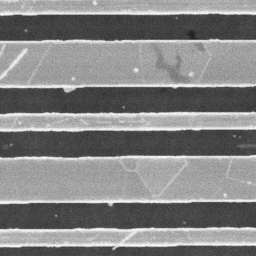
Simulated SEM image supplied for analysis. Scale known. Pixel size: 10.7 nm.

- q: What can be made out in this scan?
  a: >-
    lines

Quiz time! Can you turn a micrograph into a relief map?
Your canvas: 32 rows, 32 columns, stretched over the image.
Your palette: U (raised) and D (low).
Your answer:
UUUUUUUUUUUUUUUUUUUUUUUUUUUUUUUU
UUUUUUUUUUUUUUUUUUUUUUUUUUUUUUUU
DDDDDDDDDDDDDDDDDDDDDDDDDDDDDDDD
DDDDDDDDDDDDDDDDDDDDDDDDDDDDDDDD
DDDDDDDDDDDDDDDDDDDDDDDDDDDDDDDD
UUUUUUUUUUUUUUUUUUUUUUUUUUUUUUUU
UUUUUUUUUUUUUUUUUUUUUUUUUUUUUUUU
UUUUUUUUUUUUUUUUUUUUUUUUUUUUUUUU
UUUUUUUUUUUUUUUUUUUUUUUUUUUUUUUU
UUUUUUUUUUUUUUUUUUUUUUUUUUUUUUUU
UUUUUUUUUUUUUUUUUUUUUUUUUUUUUUUU
DDDDDDDDDDDDDDDDDDDDDDDDDDDDDDDD
DDDDDDDDDDDDDDDDDDDDDDDDDDDDDDDD
DDDDDDDDDDDDDDDDDDDDDDDDDDDDDDDD
UUUUUUUUUUUUUUUUUUUUUUUUUUUUUUUU
UUUUUUUUUUUUUUUUUUUUUUUUUUUUUUUU
DDDDDDDDDDDDDDDDDDDDDDDDDDDDDDDD
DDDDDDDDDDDDDDDDDDDDDDDDDDDDDDDD
DDDDDDDDDDDDDDDDDDDDDDDDDDDDDDDD
DDDDDDDDDDDDDDDDDDDDDDDDDDDDDDDU
UUUUUUUUUUUUUUUUUUUUUUUUUUUUUUUU
UUUUUUUUUUUUUUUUUUUUUUUUUUUUUUUU
UUUUUUUUUUUUUUUUUUUUUUUUUUUUUUUU
UUUUUUUUUUUUUUUUUUUUUUUUUUUUUUUU
UUUUUUUUUUUUUUUUUUUUUUUUUUUUUUUU
DDDDDDDDDDDDDDDDDDDDDDDDDDDDDDDD
DDDDDDDDDDDDDDDDDDDDDDDDDDDDDDDD
DDDDDDDDDDDDDDDDDDDDDDDDDDDDDDDD
DDDDDDDDDDDDDDDDDDDDDDDDDDDDDDDD
UUUUUUUUUUUUUUUUUUUUUUUUUUUUUUUU
UUUUUUUUUUUUUUUUUUUUUUUUUUUUDDUU
DDDDDDDDDDDDDDDDDDDDDDDDDDDDDDDD